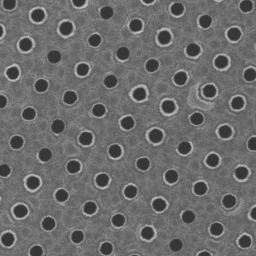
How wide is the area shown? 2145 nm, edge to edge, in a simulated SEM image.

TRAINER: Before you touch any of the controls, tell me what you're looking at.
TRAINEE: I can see a regular array of holes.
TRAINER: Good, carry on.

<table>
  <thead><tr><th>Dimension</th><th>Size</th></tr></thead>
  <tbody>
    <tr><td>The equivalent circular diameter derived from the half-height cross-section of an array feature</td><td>12.9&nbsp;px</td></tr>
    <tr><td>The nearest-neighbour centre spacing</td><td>257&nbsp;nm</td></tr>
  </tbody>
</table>